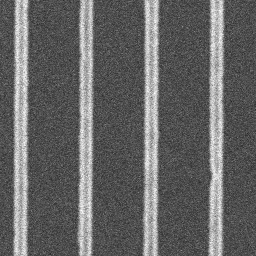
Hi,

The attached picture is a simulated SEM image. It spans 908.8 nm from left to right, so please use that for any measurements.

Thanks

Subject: one or a few lines or trenches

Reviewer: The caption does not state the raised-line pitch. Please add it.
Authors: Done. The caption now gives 0.232 um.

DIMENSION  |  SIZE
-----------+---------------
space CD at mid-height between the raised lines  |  0.198 microns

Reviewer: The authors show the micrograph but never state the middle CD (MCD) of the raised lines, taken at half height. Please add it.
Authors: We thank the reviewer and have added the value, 33.8 nm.